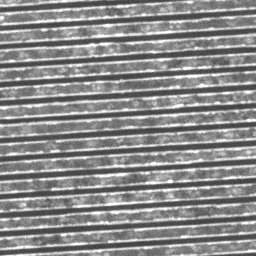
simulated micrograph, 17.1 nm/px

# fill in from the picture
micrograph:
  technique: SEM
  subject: parallel lines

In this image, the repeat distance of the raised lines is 320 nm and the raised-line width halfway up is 199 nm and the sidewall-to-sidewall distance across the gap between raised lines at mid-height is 115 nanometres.